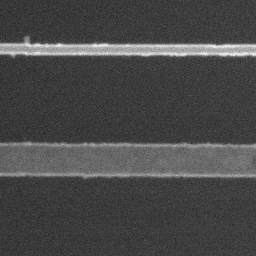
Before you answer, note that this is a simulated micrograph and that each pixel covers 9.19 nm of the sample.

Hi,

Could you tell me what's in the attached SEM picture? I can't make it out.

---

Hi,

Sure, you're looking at lines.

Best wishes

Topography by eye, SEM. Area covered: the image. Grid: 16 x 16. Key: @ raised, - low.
----------------
----------------
----------------
----------------
----------------
----------------
----------------
----------------
----------------
@@@@@@@@@@@@@@@@
@@@@@@@@@@@@@@@@
----------------
----------------
----------------
----------------
----------------